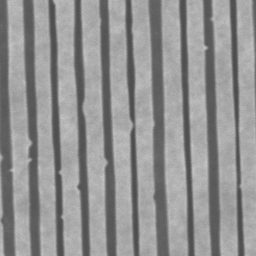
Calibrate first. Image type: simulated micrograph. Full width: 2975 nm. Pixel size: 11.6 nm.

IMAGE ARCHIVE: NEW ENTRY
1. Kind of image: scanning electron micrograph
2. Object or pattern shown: parallel lines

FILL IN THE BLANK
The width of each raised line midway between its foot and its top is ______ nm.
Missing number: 209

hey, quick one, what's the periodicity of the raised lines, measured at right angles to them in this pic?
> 0.299 um